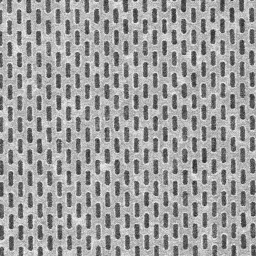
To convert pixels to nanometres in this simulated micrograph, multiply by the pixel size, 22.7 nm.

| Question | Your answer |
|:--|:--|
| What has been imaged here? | a regular array of holes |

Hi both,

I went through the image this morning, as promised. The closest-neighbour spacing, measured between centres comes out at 14.2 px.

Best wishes